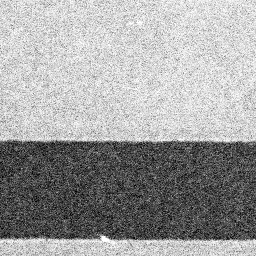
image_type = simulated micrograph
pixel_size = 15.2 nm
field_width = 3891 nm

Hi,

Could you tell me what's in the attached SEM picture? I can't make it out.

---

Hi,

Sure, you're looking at one or a few lines or trenches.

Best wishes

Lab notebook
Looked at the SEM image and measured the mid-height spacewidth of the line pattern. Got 1530 nm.